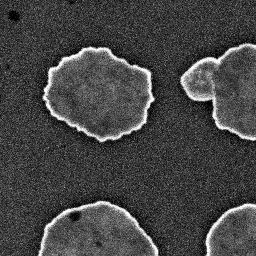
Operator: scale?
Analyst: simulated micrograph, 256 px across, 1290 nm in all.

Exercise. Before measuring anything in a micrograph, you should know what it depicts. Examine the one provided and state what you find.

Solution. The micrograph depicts raised bodies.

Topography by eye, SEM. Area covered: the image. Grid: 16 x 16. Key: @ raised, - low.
----------------
----------------
----------------
----@@@-------@@
---@@@@@@---@@@@
---@@@@@@---@@@@
---@@@@@@----@@@
----@@@@@----@@@
------@@-------@
----------------
----------------
----------------
----------------
----@@@@------@@
---@@@@@@----@@@
---@@@@@@@---@@@